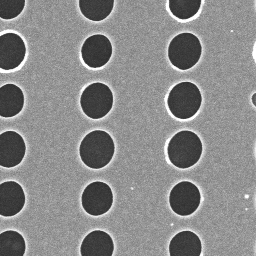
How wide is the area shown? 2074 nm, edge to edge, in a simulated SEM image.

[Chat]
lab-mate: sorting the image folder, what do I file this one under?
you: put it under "a regular array of holes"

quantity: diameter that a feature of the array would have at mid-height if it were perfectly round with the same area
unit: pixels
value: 34.9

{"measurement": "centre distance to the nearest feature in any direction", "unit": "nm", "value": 397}